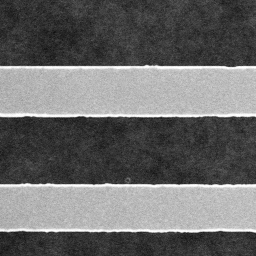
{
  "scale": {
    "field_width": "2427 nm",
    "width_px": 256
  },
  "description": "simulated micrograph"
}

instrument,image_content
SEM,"lines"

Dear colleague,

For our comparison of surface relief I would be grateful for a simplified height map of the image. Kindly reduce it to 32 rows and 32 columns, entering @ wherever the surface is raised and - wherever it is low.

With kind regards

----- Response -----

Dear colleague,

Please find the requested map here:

--------------------------------
--------------------------------
--------------------------------
--------------------------------
--------------------------------
--------------------------------
--------------------------------
--------------------------------
@@@@@@@@@@@@@@@@@@@@@@@@@@@@@@@@
@@@@@@@@@@@@@@@@@@@@@@@@@@@@@@@@
@@@@@@@@@@@@@@@@@@@@@@@@@@@@@@@@
@@@@@@@@@@@@@@@@@@@@@@@@@@@@@@@@
@@@@@@@@@@@@@@@@@@@@@@@@@@@@@@@@
@@@@@@@@@@@@@@@@@@@@@@@@@@@@@@@@
@@@-@@@@@@@@@@@@@@@@@@@@@@-@@@@-
--------------------------------
--------------------------------
--------------------------------
--------------------------------
--------------------------------
--------------------------------
--------------------------------
--------------------------------
@@@@@@@@@@@@@@@@@@@@@@@@@@@@@@@@
@@@@@@@@@@@@@@@@@@@@@@@@@@@@@@@@
@@@@@@@@@@@@@@@@@@@@@@@@@@@@@@@@
@@@@@@@@@@@@@@@@@@@@@@@@@@@@@@@@
@@@@@@@@@@@@@@@@@@@@@@@@@@@@@@@@
@@@@@@@@@@@@@@@@@@@@@@@@@@@@@@@@
--------------------------------
--------------------------------
--------------------------------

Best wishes